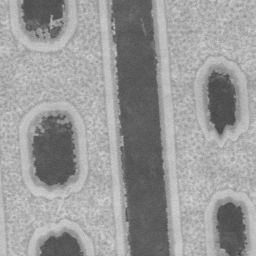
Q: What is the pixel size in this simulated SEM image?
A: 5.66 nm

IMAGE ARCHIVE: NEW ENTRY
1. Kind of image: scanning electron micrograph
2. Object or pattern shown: one or a few lines or trenches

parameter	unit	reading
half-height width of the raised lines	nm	184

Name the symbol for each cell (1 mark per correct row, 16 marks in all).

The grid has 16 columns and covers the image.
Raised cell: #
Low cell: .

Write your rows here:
#....#....######
#...###...######
##..###...######
#######...######
#######...###..#
#######...##...#
#######...###..#
##...##....##..#
#....##....##.##
#....##....#####
##...##....#####
##...##....#####
#######....##..#
#######....##...
###..##....##...
##....##...##...